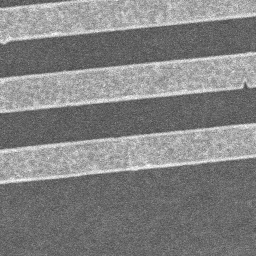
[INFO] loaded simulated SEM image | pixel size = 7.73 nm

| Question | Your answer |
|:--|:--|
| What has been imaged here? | one or a few lines or trenches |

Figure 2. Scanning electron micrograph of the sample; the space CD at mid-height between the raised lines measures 294 nm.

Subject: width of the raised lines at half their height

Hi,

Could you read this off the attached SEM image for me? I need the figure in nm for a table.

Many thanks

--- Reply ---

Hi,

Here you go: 251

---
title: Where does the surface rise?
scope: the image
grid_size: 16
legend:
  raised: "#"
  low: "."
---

.###############
##########......
#...............
..............##
....############
##############..
#####...........
................
.........#######
################
#########.......
................
................
................
................
................